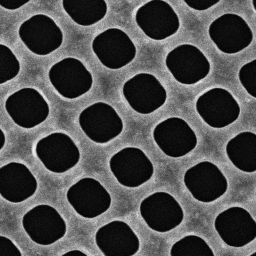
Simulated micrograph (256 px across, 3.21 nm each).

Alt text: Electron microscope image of a regular array of holes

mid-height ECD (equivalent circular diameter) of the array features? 0.13 µm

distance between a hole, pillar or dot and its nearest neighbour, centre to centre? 168 nm